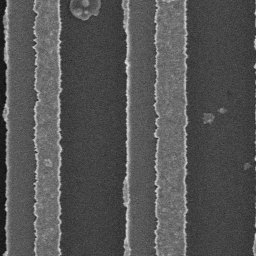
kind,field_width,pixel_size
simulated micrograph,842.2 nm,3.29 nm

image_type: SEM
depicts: lines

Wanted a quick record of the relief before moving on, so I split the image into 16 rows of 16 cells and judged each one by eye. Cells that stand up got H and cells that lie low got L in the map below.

HHHHLLLLHHHHLLLL
HHHHLLLLHHHHLLLL
HHHHLLLLHHHHLLLL
HHHHLLLLHHHHLLLL
HHHHLLLLHHHHLLLL
HHHHLLLLHHHHLLLL
HHHHLLLLHHHHLLLL
HHHHLLLLHHHHLLLL
HHHHLLLLHHHHLLLL
HHHHLLLLHHHHLLLL
HHHHLLLLHHHHLLLL
HHHHLLLLHHHHLLLL
HHHHLLLLHHHHLLLL
HHHHLLLLHHHHLLLL
HHHHLLLLHHHHLLLL
HHHHLLLLHHHHLLLL